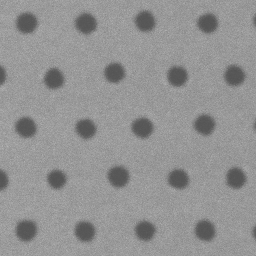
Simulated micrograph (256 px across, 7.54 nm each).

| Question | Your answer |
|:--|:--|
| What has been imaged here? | a regular array of holes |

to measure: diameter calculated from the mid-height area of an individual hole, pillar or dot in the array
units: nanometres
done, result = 157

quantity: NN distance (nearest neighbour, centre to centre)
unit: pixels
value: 57.3